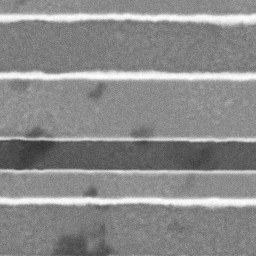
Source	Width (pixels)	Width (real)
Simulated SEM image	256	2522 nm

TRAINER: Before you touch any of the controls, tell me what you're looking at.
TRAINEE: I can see lines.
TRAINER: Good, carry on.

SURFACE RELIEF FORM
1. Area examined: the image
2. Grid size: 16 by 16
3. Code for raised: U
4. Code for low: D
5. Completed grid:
UUUUUUUUUUUUUUUU
DDDDDDDDDDDDDDDD
DDDDDDDDDDDDDDDD
DDDDDDDDDDDDDDDD
DDDDDDDDDDDDDDDD
UUUUUUUUUUUUUUUU
UUUUUUUUUUUUUUUU
UUUUUUUUUUUUUUUU
UUUUUUUUUUUUUUUU
DDDDDDDDDDDDDDDD
DDDDDDDDDDDDDDDD
UUUUUUUUUUUUUUUU
UUUUUUUUUUUUUUUU
DDDDDDDDDDDDDDDD
DDDDDDDDDDDDDDDD
DDDDDDDDDDDDDDDD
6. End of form